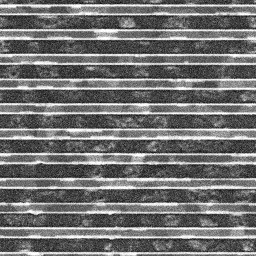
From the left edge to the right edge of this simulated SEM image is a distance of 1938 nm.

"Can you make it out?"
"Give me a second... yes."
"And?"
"parallel lines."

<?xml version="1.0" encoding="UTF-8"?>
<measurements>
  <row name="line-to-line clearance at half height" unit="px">15.5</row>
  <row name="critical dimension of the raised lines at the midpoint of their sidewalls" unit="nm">69.1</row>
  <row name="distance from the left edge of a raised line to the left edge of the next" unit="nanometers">188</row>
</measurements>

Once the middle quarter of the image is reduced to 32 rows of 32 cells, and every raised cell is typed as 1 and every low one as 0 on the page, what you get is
00000000000000000000000000000000
00000000000000000000000000000000
00000000000000000000000000000000
00000000000000000000000000000000
11111111111111111111111111111111
11111111111111111111111111111111
00000000000000000000000000000000
00000000000000000000000000000000
00000000000000000000000000000000
00000000000000000000000000000000
11111111111111111111111111111111
11111111111111111111111111111111
00000000000000000000000000000000
00000000000000000000000000000000
00000000000000000000000000000000
00000000000000000000000000000000
11111111111111111111111111111111
11111111111111111111111111111111
11111111111111111111111111111111
00000000000000000000000000000000
00000000000000000000000000000000
00000000000000000000000000000000
00000000000000000000000000000000
11111111111111111111111111111111
11111111111111111111111111111111
00000000000000000000000000000000
00000000000000000000000000000000
00000000000000000000000000000000
00000000000000000000000000000000
11111111111111111111111111111111
11111111111111111111111111111111
00000000000000000000000000000000